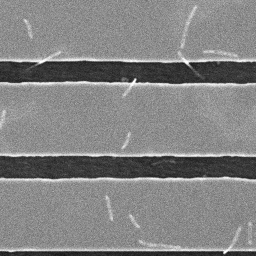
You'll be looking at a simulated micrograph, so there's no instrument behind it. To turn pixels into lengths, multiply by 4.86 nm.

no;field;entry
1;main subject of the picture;lines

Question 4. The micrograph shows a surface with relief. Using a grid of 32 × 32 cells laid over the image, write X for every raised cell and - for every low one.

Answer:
XXXXXXXXXXXXXXXXXXXXXXXXXXXXXXXX
XXXXXXXXXXXXXXXXXXXXXXXXXXXXXXXX
XXXXXXXXXXXXXXXXXXXXXXXXXXXXXXXX
XXXXXXXXXXXXXXXXXXXXXXXXXXXXXXXX
XXXXXXXXXXXXXXXXXXXXXXXXXXXXXXXX
XXXXXXXXXXXXXXXXXXXXXXXXXXXXXXXX
XXXXXXXXXXXXXXXXXXXXXXXXXXXXXXXX
XXXXXXXXXXXXXXXXXXXXXXXXXXXXXXXX
--------------------------------
--------------------------------
XXXXXXXXXXXXXXXXXXXXXXXXXXXXXXXX
XXXXXXXXXXXXXXXXXXXXXXXXXXXXXXXX
XXXXXXXXXXXXXXXXXXXXXXXXXXXXXXXX
XXXXXXXXXXXXXXXXXXXXXXXXXXXXXXXX
XXXXXXXXXXXXXXXXXXXXXXXXXXXXXXXX
XXXXXXXXXXXXXXXXXXXXXXXXXXXXXXXX
XXXXXXXXXXXXXXXXXXXXXXXXXXXXXXXX
XXXXXXXXXXXXXXXXXXXXXXXXXXXXXXXX
XXXXXXXXXXXXXXXXXXXXXXXXXXXXXXXX
XXXXXXXX---XX-XXXXXXXXXXXXXXXXXX
--------------------------------
--------------------------------
XXXXXXXXXXXXXXXXXXXXXXXXXXXXXXX-
XXXXXXXXXXXXXXXXXXXXXXXXXXXXXXXX
XXXXXXXXXXXXXXXXXXXXXXXXXXXXXXXX
XXXXXXXXXXXXXXXXXXXXXXXXXXXXXXXX
XXXXXXXXXXXXXXXXXXXXXXXXXXXXXXXX
XXXXXXXXXXXXXXXXXXXXXXXXXXXXXXXX
XXXXXXXXXXXXXXXXXXXXXXXXXXXXXXXX
XXXXXXXXXXXXXXXXXXXXXXXXXXXXXXXX
XXXXXXXXXXXXXXXXXXXXXXXXXXXXXXXX
--------------------------------